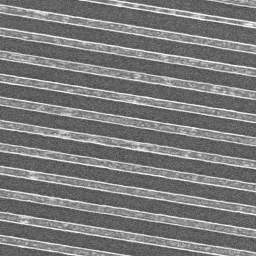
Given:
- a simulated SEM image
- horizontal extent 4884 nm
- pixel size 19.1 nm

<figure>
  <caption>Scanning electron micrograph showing parallel lines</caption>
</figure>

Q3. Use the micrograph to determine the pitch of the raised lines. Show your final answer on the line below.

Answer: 435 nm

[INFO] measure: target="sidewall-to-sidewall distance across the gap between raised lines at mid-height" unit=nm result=283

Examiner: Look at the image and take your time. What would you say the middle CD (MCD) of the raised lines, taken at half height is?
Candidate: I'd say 0.148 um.